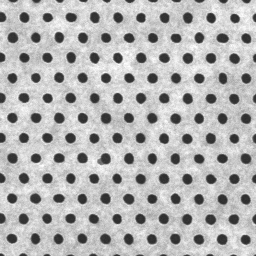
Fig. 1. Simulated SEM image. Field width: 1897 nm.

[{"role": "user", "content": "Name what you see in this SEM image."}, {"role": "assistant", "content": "a regular array of holes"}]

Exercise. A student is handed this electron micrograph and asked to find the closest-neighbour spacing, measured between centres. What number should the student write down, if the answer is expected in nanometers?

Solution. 170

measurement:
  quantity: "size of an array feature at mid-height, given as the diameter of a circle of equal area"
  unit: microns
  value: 0.0752